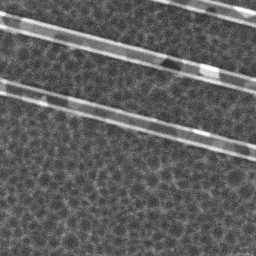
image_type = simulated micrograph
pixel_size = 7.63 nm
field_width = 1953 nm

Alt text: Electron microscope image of one or a few lines or trenches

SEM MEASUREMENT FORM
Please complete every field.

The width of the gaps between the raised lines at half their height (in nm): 399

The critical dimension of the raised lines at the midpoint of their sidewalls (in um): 0.0959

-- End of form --